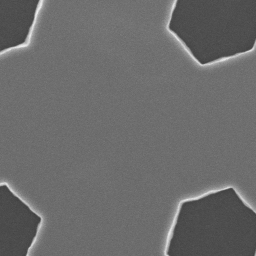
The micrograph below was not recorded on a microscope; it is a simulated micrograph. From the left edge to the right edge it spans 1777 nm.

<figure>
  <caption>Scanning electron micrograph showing holes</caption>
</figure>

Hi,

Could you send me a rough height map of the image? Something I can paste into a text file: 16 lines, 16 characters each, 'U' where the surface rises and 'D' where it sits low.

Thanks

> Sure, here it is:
DDUUUUUUUUUDDDDD
DDUUUUUUUUUDDDDD
DDUUUUUUUUUDDDDD
UUUUUUUUUUUUDDDU
UUUUUUUUUUUUUUUU
UUUUUUUUUUUUUUUU
UUUUUUUUUUUUUUUU
UUUUUUUUUUUUUUUU
UUUUUUUUUUUUUUUU
UUUUUUUUUUUUUUUU
UUUUUUUUUUUUUUUU
UUUUUUUUUUUUUUUU
DUUUUUUUUUUUDDDU
DDUUUUUUUUUDDDDD
DDUUUUUUUUUDDDDD
DDUUUUUUUUDDDDDD